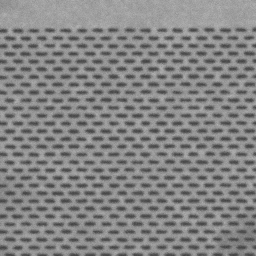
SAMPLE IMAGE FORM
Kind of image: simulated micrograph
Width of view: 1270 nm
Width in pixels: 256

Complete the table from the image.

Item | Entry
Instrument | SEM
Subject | a regular array of holes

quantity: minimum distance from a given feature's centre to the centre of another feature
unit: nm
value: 53